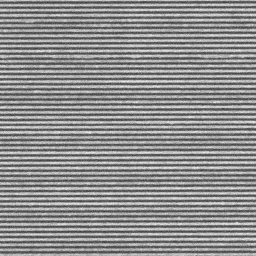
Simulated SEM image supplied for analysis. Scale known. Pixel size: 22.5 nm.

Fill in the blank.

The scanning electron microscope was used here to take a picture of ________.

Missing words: parallel lines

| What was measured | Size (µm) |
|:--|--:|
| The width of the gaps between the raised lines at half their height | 0.0675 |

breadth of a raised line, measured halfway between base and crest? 2 px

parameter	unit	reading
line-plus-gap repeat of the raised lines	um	0.115